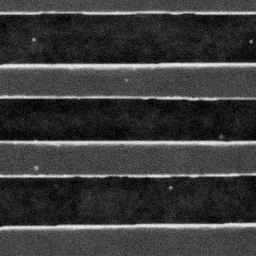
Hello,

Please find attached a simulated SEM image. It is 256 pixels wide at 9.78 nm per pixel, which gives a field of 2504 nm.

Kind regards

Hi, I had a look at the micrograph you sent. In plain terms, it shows lines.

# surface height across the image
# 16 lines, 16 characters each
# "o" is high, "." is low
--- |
oooooooooooooooo
................
................
................
oooooooooooooooo
oooooooooooooooo
................
................
................
oooooooooooooooo
oooooooooooooooo
................
................
................
oooooooooooooooo
oooooooooooooooo